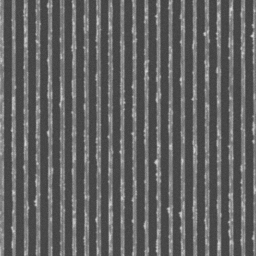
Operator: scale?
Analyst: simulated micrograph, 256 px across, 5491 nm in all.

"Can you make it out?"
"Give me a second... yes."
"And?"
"parallel lines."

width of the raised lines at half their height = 3.25 pixels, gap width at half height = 190 nanometres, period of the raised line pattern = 259 nm